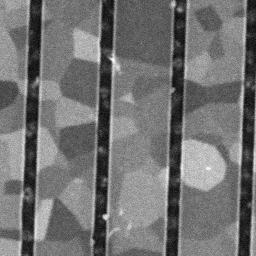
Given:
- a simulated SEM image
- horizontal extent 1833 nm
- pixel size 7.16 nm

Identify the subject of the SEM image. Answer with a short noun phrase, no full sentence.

one or a few lines or trenches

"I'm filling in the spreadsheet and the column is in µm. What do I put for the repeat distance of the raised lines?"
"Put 0.517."